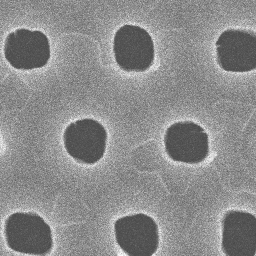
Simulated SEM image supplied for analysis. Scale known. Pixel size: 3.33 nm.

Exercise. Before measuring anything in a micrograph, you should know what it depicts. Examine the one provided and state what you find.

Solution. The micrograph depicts holes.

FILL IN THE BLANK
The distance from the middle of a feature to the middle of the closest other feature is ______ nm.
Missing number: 344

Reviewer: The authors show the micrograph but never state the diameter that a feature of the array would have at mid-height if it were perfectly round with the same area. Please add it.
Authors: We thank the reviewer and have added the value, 146 nm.